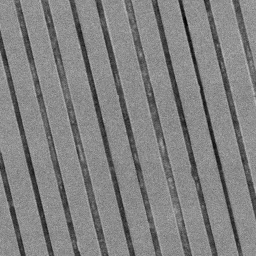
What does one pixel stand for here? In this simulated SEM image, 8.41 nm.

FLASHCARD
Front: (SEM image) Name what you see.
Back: parallel lines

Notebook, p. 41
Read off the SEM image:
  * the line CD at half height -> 173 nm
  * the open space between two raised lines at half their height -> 0.0502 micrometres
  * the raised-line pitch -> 222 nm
